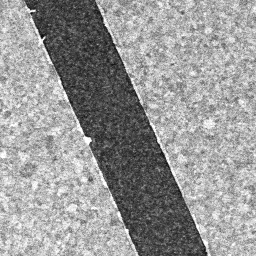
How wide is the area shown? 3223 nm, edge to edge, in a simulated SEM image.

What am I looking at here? one or a few lines or trenches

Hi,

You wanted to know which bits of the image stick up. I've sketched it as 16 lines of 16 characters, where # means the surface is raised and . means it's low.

##....##########
##.....#########
###....#########
###.....########
####....########
####....########
####.....#######
#####....#######
#####.....######
######....######
######.....#####
#######....#####
#######.....####
########....####
########....####
########.....###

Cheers